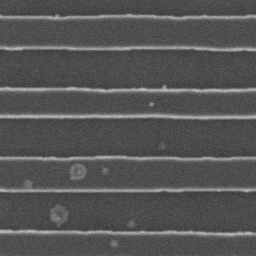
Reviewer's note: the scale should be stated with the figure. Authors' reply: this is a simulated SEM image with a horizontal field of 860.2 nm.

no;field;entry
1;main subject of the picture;lines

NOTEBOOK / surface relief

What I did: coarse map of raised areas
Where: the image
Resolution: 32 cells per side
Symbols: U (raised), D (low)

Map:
DDDDDDDDDDDDDDDDDDDDDDDDDDDDDDDD
DDDDDDDDDDDDDDDDDDDDDDDDDDDDDDDD
UUUUUUUUUUUUUUUUUUUUUUUUUUUUUUUU
UUUUUUUUUUUUUUUUUUUUUUUUUUUUUUUU
UUUUUUUUUUUUUUUUUUUUUUUUUUUUUUUU
UUUUUUUUUUUUUUUUUUUUUUUUUUUUUUUU
DDDDDDDDDDDDDDDDDDDDDDDDDDDDDDDD
DDDDDDDDDDDDDDDDDDDDDDDDDDDDDDDD
DDDDDDDDDDDDDDDDDDDDDDDDDDDDDDDD
DDDDDDDDDDDDDDDDDDDDDDDDDDDDDDDD
DDDDDDDDDDDDDDDDDDDDDDDDDDDDDDDD
UUUUUUUUUUUUUUUUUUUUUUUUUUUUUUUU
UUUUUUUUUUUUUUUUUUUUUUUUUUUUUUUU
UUUUUUUUUUUUUUUUUUUUUUUUUUUUUUUU
UUUUUUUUUUUUUUUUUUUUUUUUUUUUUUUU
DDDDDDDDDDDDDDDDDDDDDDDDDDDDDDDD
DDDDDDDDDDDDDDDDDDDDDDDDDDDDDDDD
DDDDDDDDDDDDDDDDDDDDDDDDDDDDDDDD
DDDDDDDDDDDDDDDDDDDDDDDDDDDDDDDD
DDDDDDDDDDDDDDDDDDDDDDDDDDDDDDDD
UUUUUUUUUUUUUUUUUUUUUUUUUUUUUUUU
UUUUUUUUUUUUUUUUUUUUUUUUUUUUUUUU
UUUUUUUUUUUUUUUUUUUUUUUUUUUUUUUU
UUUUUUUUUUUUUUUUUUUUUUUUUUUUUUUU
DDDDDDDDDDDDDDDDDDDDDDDDDDDDDDDD
DDDDDDDDDDDDDDDDDDDDDDDDDDDDDDDD
DDDDDDDDDDDDDDDDDDDDDDDDDDDDDDDD
DDDDDDDDDDDDDDDDDDDDDDDDDDDDDDDD
DDDDDDDDDDDDDDDDDDDDDDDDDDDDDDDD
UUUUUUUUUUUUUUUUUUUUUUUUUUUUUUUU
UUUUUUUUUUUUUUUUUUUUUUUUUUUUUUUU
UUUUUUUUUUUUUUUUUUUUUUUUUUUUUUUU